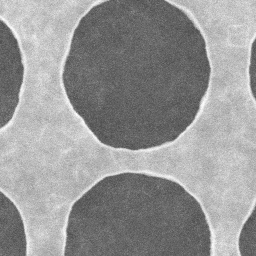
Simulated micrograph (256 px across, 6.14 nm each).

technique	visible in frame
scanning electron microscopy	holes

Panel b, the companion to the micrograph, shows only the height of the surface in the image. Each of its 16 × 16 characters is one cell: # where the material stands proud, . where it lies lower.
######.....#####
#####.......####
.###.........###
.###.........###
.###.........###
.###.........###
.###.........###
.####.......####
######.....#####
################
################
######.....#####
.####.......####
.###.........###
..##.........##.
..##.........##.